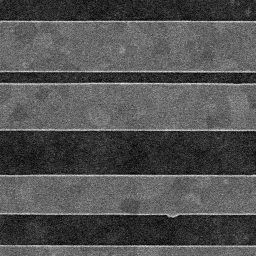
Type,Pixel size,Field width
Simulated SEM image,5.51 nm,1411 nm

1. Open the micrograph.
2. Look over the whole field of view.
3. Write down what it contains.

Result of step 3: one or a few lines or trenches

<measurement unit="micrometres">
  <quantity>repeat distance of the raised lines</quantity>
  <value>0.408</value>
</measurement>